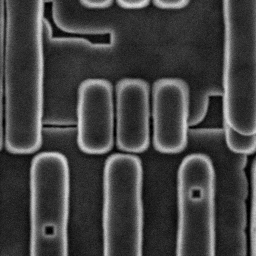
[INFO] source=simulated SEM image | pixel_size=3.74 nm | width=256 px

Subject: wiring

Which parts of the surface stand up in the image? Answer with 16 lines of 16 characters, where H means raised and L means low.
HHHLLLLLLLLLLLHH
HHHLLLLLLLLLLLHH
HHHLLLLLLLLLLLHH
HHHLLLLLLLLLLLHH
HHHLLLLLLLLLLLHH
HHHLLHHHHHHHLLHH
HHHLLHHHHHHHLLHH
HHHLLHHHHHHHLLHH
HHHLLHHHHHHHLLHH
LHLLLLHHHLHLLLLL
LLHHLLLHHLLHHLLL
LLHHLLLHHLLHHLLL
LLHHLLLHHLLHHLLL
LLHHLLLHHLLHHLLL
LLHHLLLHHLLHHLLL
LLHHLLLHHLLHHLLL